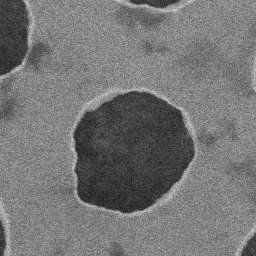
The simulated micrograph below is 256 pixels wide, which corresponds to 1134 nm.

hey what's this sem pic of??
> holes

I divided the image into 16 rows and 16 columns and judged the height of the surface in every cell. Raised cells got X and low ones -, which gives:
--XXXXXXXXXXXXXX
--XXXXXXXXXXXXXX
--XXXXXXXXXXXXXX
--XXXXXXXXXXXXXX
-XXXXXXXXXXXXXXX
XXXXXXXXXXXXXXXX
XXXXXX-----XXXXX
XXXXX-------XXXX
XXXXX-------XXXX
XXXXX-------XXXX
XXXXX-------XXXX
XXXXX------XXXXX
XXXXX-----XXXXXX
XXXXXXXXXXXXXXXX
XXXXXXXXXXXXXXXX
XXXXXXXXXXXXXXX-